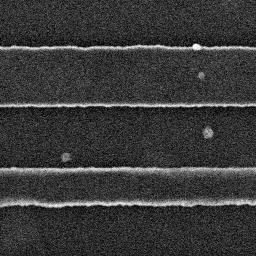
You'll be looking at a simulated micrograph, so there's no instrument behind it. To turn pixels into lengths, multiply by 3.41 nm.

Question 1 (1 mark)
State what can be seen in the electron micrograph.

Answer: lines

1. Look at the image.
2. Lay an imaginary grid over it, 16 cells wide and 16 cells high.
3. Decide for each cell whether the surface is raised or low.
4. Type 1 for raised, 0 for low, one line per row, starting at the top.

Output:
0000000000000000
0000000000000000
0000000000000000
1111111111111111
1111111111111111
1111111111111111
1111111111111111
0000000000000000
0000000000000000
0000000000000000
0000000100000000
1111111111111111
1111111111111111
0000000000000000
0000000000000000
0000000000000000